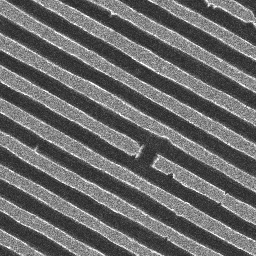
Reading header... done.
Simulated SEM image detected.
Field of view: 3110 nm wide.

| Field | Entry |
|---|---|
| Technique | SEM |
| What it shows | parallel lines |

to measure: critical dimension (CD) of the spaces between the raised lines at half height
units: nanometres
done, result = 157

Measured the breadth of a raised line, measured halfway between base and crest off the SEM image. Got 0.181 um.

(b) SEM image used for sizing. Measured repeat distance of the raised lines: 346 nm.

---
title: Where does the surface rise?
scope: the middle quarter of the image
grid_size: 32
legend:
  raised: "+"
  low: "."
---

......++++++++......++++++++....
+.......+++++++.......++++++++..
+++.......+++++++......++++++++.
+++++.......++++++.......+++++++
+++++++.......++++++.......+++++
+++++++++.......++++++.......+++
..+++++++++......+++++++.......+
....++++++++.......+++++++......
......++++++++......++++++++....
........++++++++......++++++++..
++.......++++++++........++++++.
++++.......++++++++.......++++++
++++++.......++++++++.......++++
+++++++........++++++++......+++
..+++++++.......++++++++.......+
....+++++++........+++++++......
......+++++++........+++++++....
.......++++++++.......++++++++..
++.......++++++++.......+++++++.
++++.......+++++++........++++++
++++++......++++++++........++++
+++++++.......++++++.........+++
.++++++++.......+++............+
...++++++++............++.......
.....++++++++.........+++++.....
.......++++++++.......+++++++...
++......++++++++.......++++++++.
+++........+++++++.......+++++++
+++++........+++++++.......+++++
+++++++.......++++++++.......+++
.++++++++.......+++++++.......++
...++++++++.......+++++++.......